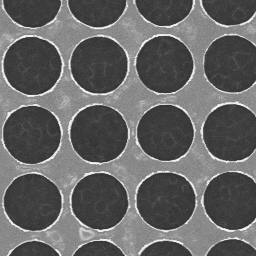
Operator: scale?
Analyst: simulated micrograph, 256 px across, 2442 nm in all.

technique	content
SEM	a regular array of holes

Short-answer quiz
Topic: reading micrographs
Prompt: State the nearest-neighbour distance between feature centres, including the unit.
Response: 633 nanometers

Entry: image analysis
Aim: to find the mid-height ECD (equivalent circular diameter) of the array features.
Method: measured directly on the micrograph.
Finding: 549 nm